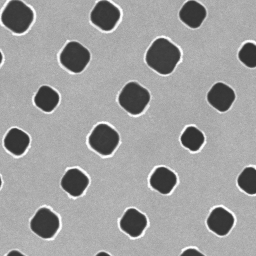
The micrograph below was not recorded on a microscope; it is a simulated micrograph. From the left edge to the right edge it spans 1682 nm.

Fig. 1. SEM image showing a regular array of holes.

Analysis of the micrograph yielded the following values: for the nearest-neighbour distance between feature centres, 0.335 um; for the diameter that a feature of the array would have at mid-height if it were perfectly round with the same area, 170 nanometres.